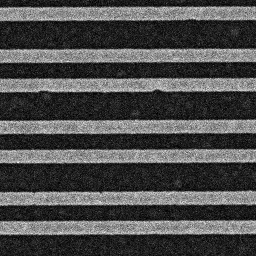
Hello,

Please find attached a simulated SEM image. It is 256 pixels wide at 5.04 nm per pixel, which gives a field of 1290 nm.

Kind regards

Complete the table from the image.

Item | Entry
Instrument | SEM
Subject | parallel lines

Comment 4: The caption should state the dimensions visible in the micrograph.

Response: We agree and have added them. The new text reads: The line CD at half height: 0.0668 um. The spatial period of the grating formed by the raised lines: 180 nm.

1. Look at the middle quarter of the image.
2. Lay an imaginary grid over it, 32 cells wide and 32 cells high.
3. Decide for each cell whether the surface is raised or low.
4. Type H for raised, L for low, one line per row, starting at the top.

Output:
LLLLLLLLLLLLLLLLLLLLLLLLLLLLLLLL
LLLLLLLLLLLLLLLLLLLLLLLLLLLLLLLL
LLLLLLLLLLLLLLLLLLLLLLLLLLLLLLLL
LLLLLLLLLLLLLLLLLLLLLLLLLLLLLLLL
HHHHHHHHHHHHHHHHHHHHHHHHHHHHHHHH
HHHHHHHHHHHHHHHHHHHHHHHHHHHHHHHH
HHHHHHHHHHHHHHHHHHHHHHHLHHHHHHHH
LLLLLLLLLLLLLLLLLLLLLLLLLLLLLLLL
LLLLLLLLLLLLLLLLLLLLLLLLLLLLLLLL
LLLLLLLLLLLLLLLLLLLLLLLLLLLLLLLL
LLLLLLLLLLLLLLLLLLLLLLLLLLLLLLLL
LLLLLLLLLLLLLLLLLLLLLLLLLLLLLLLL
LLLLLLLLLLLLLLLLLLLLLLLLLLLLLLLL
LLLLLLLLLLLLLLLLLLLLLLLLLLLLLLLL
HHHHHHHHHHHHHHHHHHHHHHHHHHHHHHHH
HHHHHHHHHHHHHHHHHHHHHHHHHHHHHHHH
HHHHHHHHHHHHHHHHHHHHHHHHHHHHHHHH
LLLLLLLLLLLLLLLLLLLLLLLLLLLLLLLL
LLLLLLLLLLLLLLLLLLLLLLLLLLLLLLLL
LLLLLLLLLLLLLLLLLLLLLLLLLLLLLLLL
LLLLLLLLLLLLLLLLLLLLLLLLLLLLLLLL
LLLLLLLLLLLHHHHHHHHHHHHHHHHHHHHH
HHHHHHHHHHHHHHHHHHHHHHHHHHHHHHHH
HHHHHHHHHHHHHHHHHHHHHHHHHHHHHHHH
HHHHHHHHHHHHHHHHHHHHHHHHHHHHHHHH
LLLLLLLLLLLLLLLLLLLLLLLLLLLLLLLL
LLLLLLLLLLLLLLLLLLLLLLLLLLLLLLLL
LLLLLLLLLLLLLLLLLLLLLLLLLLLLLLLL
LLLLLLLLLLLLLLLLLLLLLLLLLLLLLLLL
LLLLLLLLLLLLLLLLLLLLLLLLLLLLLLLL
LLLLLLLLLLLLLLLLLLLLLLLLLLLLLLLL
LLLLLLLLLLLLLLLLLLLLLLLLLLLLLLLL